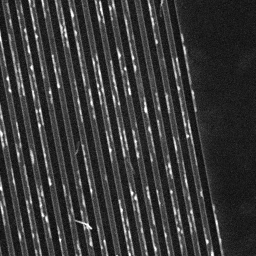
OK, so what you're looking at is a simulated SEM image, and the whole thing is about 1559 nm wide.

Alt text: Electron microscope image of parallel lines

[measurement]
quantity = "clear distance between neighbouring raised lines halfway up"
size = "45.7 nanometres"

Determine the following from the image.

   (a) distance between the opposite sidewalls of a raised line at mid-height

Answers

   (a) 35.2 nm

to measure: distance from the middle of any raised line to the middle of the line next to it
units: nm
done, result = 79.5